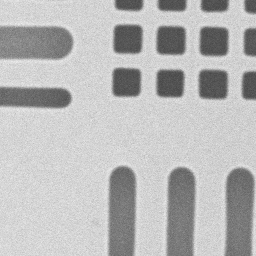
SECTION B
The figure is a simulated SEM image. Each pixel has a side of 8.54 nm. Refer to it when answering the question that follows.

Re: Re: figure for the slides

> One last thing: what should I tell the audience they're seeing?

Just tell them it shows groups of lines, slits or small figures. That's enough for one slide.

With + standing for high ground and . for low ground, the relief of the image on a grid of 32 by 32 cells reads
++++++++++++++....++...++....+..
+++++++++++++++++++++..+++..+++.
++++++++++++++++++++++++++++++++
........++++++....++...++...+++.
.........+++++....++...++....+..
.........+++++....+....++....+..
.........+++++...+++...++....+..
..+++..+++++++++++++++++++++++++
++++++++++++++...+++++++++++++++
++++++++++++++....++...++....+..
++++++++++++++....+....++....+..
.........+++++....++...++....+..
.........++++++++++++++++++.+++.
++......++++++++++++++++++++++++
++++++++++++++++++++++++++++++++
++++++++++++++++++++++++++++++++
++++++++++++++++++++++++++++++++
++++++++++++++++++++++++++++++++
++++++++++++++++++++++++++++++++
++++++++++++++++++++++++++++++++
++++++++++++++++++++++++++++++++
++++++++++++++...++++...+++++..+
++++++++++++++...++++...++++....
+++++++++++++....++++....+++....
+++++++++++++....++++....+++....
+++++++++++++....++++....+++....
+++++++++++++....++++....+++....
+++++++++++++....++++...++++....
+++++++++++++....++++...++++....
+++++++++++++....++++...++++....
+++++++++++++....++++...++++....
+++++++++++++....++++...++++....